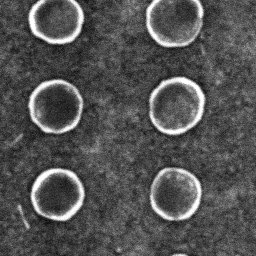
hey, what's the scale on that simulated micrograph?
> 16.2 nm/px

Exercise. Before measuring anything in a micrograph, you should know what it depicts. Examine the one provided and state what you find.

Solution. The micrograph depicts raised bodies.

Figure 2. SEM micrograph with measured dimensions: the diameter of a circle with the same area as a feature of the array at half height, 829 nm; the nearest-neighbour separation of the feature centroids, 1430 nm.